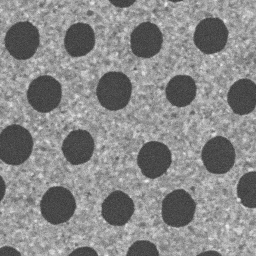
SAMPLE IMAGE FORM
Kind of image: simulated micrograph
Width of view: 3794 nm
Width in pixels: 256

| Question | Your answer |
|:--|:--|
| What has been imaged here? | a regular array of holes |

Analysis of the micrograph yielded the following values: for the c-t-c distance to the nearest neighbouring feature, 886 nanometres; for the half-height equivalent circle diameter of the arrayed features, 548 nm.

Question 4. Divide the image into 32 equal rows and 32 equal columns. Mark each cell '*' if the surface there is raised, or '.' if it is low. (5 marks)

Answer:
**************...***************
********************************
*************************...****
*....****...*****...****....****
*....***....****....****.....***
*....***....****....****....****
*....***...******...*****..*****
**..****************************
********************************
*****.*******...******..********
****....****.....****....****...
***.....****.....****....***....
***.....****....*****...****....
****...******..**************...
********************************
********************************
....*****..*********************
....****....**************...***
....****....******...****....***
....****....*****.....***.....**
*..******.*******....****....***
******************...*****...**.
.*****************************..
.*****..**********************..
.****....****...*****...******..
*****.....***....***....******..
*****....****....***....********
******...****...****....********
********************************
********************************
****************...*************
..*******...****....*****..*****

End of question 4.